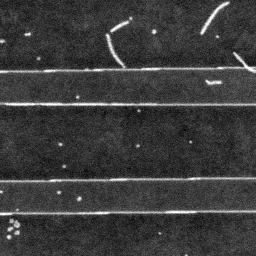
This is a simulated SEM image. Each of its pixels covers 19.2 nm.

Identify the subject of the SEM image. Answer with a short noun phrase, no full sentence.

lines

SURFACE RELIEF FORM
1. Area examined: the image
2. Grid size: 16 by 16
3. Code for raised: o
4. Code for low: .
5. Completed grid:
................
................
................
................
oooooooooooooooo
oooooooooooooooo
oooooooooooooooo
................
................
................
................
oooooooooooooooo
oooooooooooooooo
................
................
................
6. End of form